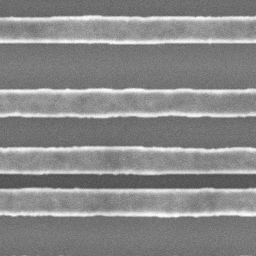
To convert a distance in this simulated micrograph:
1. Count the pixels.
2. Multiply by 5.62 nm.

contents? lines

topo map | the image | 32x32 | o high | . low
................................
................................
oooooooooooooooooooooooooooooooo
oooooooooooooooooooooooooooooooo
oooooooooooooooooooooooooooooooo
................................
................................
................................
................................
................................
................................
oooooooooooooooooooooooooooooooo
oooooooooooooooooooooooooooooooo
oooooooooooooooooooooooooooooooo
o.ooooooooooooo..ooo...oo.ooooo.
................................
................................
................................
..........oooooooo..............
oooooooooooooooooooooooooooooooo
oooooooooooooooooooooooooooooooo
oooooooooooooooooooooooooooooooo
................................
................................
oooooooooooooooooooooooooooooooo
oooooooooooooooooooooooooooooooo
oooooooooooooooooooooooooooooooo
................................
................................
................................
................................
................................